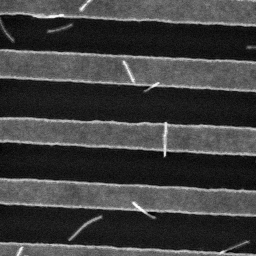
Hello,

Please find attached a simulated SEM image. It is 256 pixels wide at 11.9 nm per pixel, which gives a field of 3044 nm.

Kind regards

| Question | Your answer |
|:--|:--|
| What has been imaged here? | lines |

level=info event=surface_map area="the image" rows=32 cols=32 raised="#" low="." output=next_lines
################################
################################
..............##################
................................
................................
................................
########........................
##########################......
################################
################################
...............#################
................................
................................
................................
................................
#####################...........
################################
################################
.............###################
................................
................................
................................
#####...........................
#########################.......
################################
..##############################
..................#..###########
................................
................................
................................
####.#..........................
############################....